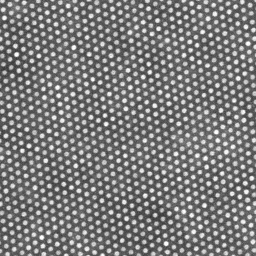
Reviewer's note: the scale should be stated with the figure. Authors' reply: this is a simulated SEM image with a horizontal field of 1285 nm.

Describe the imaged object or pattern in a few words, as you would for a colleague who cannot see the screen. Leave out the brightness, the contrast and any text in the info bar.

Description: a regular array of raised bodies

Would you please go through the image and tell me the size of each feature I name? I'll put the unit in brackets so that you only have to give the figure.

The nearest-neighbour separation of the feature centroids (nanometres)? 40.3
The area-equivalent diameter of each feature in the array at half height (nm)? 21.2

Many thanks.